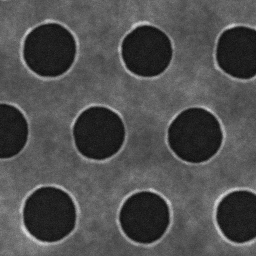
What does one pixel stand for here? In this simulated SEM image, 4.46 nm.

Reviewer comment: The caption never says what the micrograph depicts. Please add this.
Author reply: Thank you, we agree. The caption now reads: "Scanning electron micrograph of holes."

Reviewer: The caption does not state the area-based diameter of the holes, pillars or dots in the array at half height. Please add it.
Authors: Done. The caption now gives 242 nanometres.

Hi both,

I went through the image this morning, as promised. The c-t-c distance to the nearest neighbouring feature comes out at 425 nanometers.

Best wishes